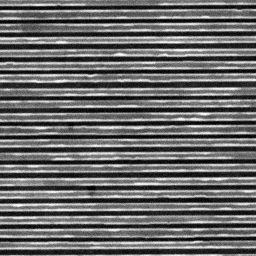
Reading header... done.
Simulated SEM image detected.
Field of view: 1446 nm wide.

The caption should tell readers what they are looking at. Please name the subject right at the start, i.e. parallel lines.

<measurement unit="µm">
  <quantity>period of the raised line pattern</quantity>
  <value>0.0725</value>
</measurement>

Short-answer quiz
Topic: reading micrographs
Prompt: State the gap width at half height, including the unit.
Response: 28.2 nanometers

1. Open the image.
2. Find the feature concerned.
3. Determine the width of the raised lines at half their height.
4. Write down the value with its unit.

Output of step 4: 7.63 px